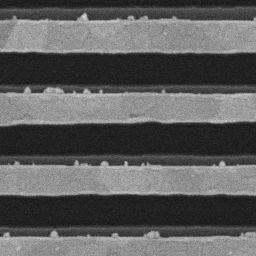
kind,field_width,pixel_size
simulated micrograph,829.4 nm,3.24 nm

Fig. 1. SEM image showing lines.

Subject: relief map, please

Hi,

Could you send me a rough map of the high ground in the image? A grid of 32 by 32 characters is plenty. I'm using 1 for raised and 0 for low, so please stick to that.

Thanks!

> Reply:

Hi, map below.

00000000000000000000000000000000
11111111111111111111111111111111
11111111111111111111111111111111
11111111111111111111111111111111
11111111111111111111111111111111
11111111111111111111111111111111
11111111111111111111111111111111
00000000000000000000000000000000
00000000000000000000000000000000
00000000000000000000000000000000
00000000000000000000000000000000
11111111111111111111111111111111
11111111111111111111111111111111
11111111111111111111111111111111
11111111111111111111111111111111
11000000000000000000000000000000
00000000000000000000000000000000
00000000000000000000000000000000
00000000000000000000000000000000
00000000001111110111111110000111
11111111111111111111111111111111
11111111111111111111111111111111
11111111111111111111111111111111
11111111111111111111111111111111
00000000000000000000000000000000
00000000000000000000000000000000
00000000000000000000000000000000
00000000000000000000000000000000
11000000111111111111111111111111
11111111111111111111111111111111
11111111111111111111111111111111
11111111111111111111111111111111